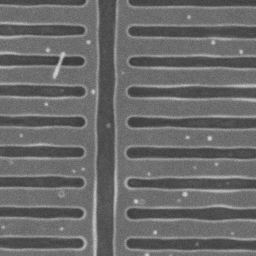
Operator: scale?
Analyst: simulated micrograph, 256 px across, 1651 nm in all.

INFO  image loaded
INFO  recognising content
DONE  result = groups of lines, slits or small figures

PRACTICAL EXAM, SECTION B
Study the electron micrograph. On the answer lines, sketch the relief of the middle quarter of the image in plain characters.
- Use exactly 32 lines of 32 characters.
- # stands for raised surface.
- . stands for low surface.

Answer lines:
....#####....####...............
#########....###################
#########....###################
########.....###################
########.....###################
.#######.....#################..
......##.....###................
.....###.....###................
########.....####...............
########.....###################
########.....###################
########.....###################
########.....###################
.....###.....###................
......##.....###................
.....###.....###................
########.....###################
########.....###################
########.....###################
########.....###################
.#######.....#####...###########
.....###.....###................
.....###.....###................
....####.....###................
########.....###################
########.....###################
########.....###################
########.....###################
....####.....###..######........
.....###.....###................
.....###.....###................
########.....###################